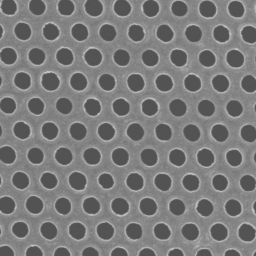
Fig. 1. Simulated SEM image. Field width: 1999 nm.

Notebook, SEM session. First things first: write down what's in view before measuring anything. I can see a regular array of holes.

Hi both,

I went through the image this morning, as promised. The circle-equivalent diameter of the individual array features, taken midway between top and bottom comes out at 133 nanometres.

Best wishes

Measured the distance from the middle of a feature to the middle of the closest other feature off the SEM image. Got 220 nm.